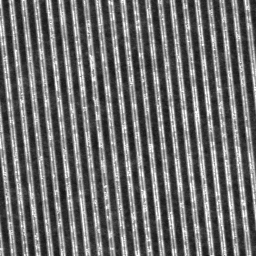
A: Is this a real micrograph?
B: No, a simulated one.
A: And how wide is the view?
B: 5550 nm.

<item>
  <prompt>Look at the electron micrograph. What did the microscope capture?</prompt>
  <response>parallel lines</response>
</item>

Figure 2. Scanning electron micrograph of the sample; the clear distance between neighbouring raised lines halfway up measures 7.83 pixels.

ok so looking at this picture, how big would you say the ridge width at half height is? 97 nanometers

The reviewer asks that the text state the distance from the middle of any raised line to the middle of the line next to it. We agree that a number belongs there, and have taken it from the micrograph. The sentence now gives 12.3 px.